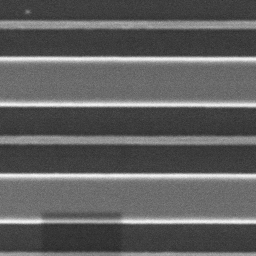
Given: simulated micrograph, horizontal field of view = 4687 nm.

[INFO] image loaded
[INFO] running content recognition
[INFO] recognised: lines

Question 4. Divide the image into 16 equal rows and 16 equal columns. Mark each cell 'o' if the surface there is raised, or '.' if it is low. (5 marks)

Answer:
................
................
................
................
oooooooooooooooo
oooooooooooooooo
oooooooooooooooo
................
................
................
................
oooooooooooooooo
oooooooooooooooo
oooooooooooooooo
................
................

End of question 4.